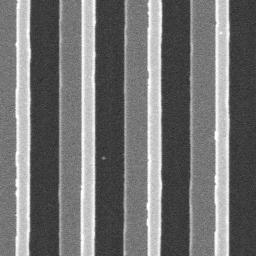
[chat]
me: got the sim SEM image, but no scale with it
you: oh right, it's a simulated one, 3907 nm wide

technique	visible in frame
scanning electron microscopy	lines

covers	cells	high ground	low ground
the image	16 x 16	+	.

++..++..++..++..
++..++..++..++..
++..++..++..++..
++..++..++..++..
++..++..++..++..
++..++..++..++..
++..++..++..++..
++..++..++..++..
++..++..++..++..
++..++..++..++..
++..++..++..++..
++..++..++..++..
++..++..++..++..
++..++..++..++..
++..++..++..++..
++..++..++..++..